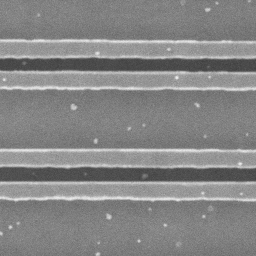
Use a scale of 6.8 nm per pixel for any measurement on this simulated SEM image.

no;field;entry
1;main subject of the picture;lines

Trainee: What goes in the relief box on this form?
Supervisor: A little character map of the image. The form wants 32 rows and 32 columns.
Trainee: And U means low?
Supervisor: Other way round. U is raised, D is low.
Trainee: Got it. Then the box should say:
DDDDDDDDDDDDDDDDDDDDDDDDDDDDDDDD
DDDDDDDDDDDDDDDDDDDDDDDDDDDDDDDD
DDDDDDDDDDDDDDDDDDDDDDDDDDDDDDDD
DDDDDDDDDDDDDDDDDDDDDDDDDDDDDDDD
DDDDDDDDDDDDDDDDDDDDDDDDDDDDDDDD
UUUUUUUUUUUUUUUUUUUUUUUUUUUUUUUU
UUUUUUUUUUUUUUUUUUUUUUUUUUUUUUUU
DDDDDDDDDDDDDDDDDDDDDDDDDDDDDDDD
DDDDDDDDDDDDDDDDDDDDDDDDDDDDDDDD
UUUUUUUUUUUUUUUUUUUUUUUUUUUUUUUU
UUUUUUUUUUUUUUUUUUUUUUUUUUUUUUUU
DDDDDDDDDDDDDDDDDDDDDDDDDDDDDDDD
DDDDDDDDDDDDDDDDDDDDDDDDDDDDDDDD
DDDDDDDDDDDDDDDDDDDDDDDDDDDDDDDD
DDDDDDDDDDDDDDDDDDDDDDDDDDDDDDDD
DDDDDDDDDDDDDDDDDDDDDDDDDDDDDDDD
DDDDDDDDDDDDDDDDDDDDDDDDDDDDDDDD
DDDDDDDDDDDDDDDDDDDDDDDDDDDDDDDD
DDDDDDDDDDDDDDDDDDDDDDDDDDDDDDDD
UUUUUUUUUUUUUUUUUUUUUUUUUUUUUUUU
UUUUUUUUUUUUUUUUUUUUUUUUUUUUUUUU
DDDDDDDDDDDDDDDDDDDDDDDDDDDDDDDD
DDDDDDDDDDDDDDDDDDDDDDDDDDDDDDDD
UUUUUUUUUUUUUUUUUUUUUUUUUUUUUUUU
UUUUUUUUUUUUUUUUUUUUUUUUUUUUUUUU
DDDDDDDDDDDDDDDDDDDDDDDDDDDDDDDD
DDDDDDDDDDDDDDDDDDDDDDDDDDDDDDDD
DDDDDDDDDDDDDDDDDDDDDDDDDDDDDDDD
DDDDDDDDDDDDDDDDDDDDDDDDDDDDDDDD
DDDDDDDDDDDDDDDDDDDDDDDDDDDDDDDD
DDDDDDDDDDDDDDDDDDDDDDDDDDDDDDDD
DDDDDDDDDDDDDDDDDDDDDDDDDDDDDDDD